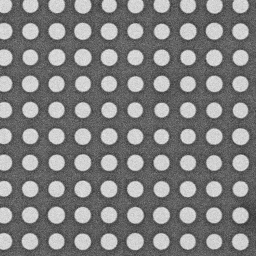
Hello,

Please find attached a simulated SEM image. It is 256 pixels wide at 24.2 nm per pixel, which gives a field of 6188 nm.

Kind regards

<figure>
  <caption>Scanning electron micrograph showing an array of small figures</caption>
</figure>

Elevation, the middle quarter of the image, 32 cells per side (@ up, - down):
--------------------------------
--------------------------------
--------------------------------
----@@----@@-----@@----@@@----@@
---@@@@---@@@---@@@@---@@@---@@@
---@@@@---@@@---@@@@---@@@---@@@
----@@----@@-----@@----@@@----@@
--------------------------------
--------------------------------
--------------------------------
---@@@----@@@---@@@----@@@---@@@
---@@@----@@@---@@@@---@@@---@@@
---@@@----@@@---@@@----@@@---@@@
--------------------------------
--------------------------------
--------------------------------
----@@----@@-----@@-----@-----@@
---@@@@--@@@@---@@@@---@@@---@@@
---@@@@--@@@@---@@@@---@@@---@@@
---@@@----@@@---@@@----@@-----@@
--------------------------------
--------------------------------
--------------------------------
---@@@----@@@---@@@----@@@----@@
---@@@@--@@@@---@@@@---@@@---@@@
---@@@---@@@@---@@@@---@@@---@@@
----@------@--------------------
--------------------------------
--------------------------------
----@@----@@-----@------@-----@@
---@@@---@@@@---@@@@---@@@---@@@
---@@@@--@@@@---@@@@---@@@---@@@